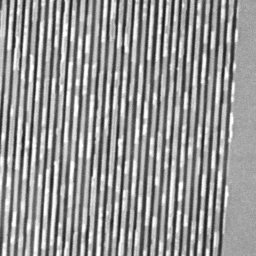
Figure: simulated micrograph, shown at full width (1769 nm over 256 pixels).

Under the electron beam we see parallel lines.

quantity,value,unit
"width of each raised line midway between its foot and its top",25.9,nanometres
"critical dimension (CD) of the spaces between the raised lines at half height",25.9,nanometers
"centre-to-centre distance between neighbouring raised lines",53.9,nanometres